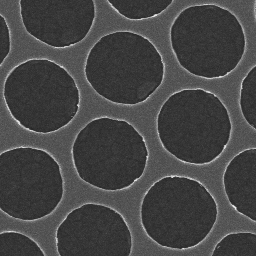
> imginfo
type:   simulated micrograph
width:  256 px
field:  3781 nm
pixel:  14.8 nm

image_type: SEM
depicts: holes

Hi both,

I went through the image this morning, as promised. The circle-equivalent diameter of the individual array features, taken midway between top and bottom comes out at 1.09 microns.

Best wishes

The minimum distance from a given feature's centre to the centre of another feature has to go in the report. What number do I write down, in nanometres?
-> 1290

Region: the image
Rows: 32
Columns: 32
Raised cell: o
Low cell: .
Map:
ooo.........oo.......ooooooooooo
ooo.........ooo.....ooo......ooo
.oo.........oooooooooo........oo
.oo........oooooooooo.........oo
.ooo.......oo.....ooo.........oo
.ooooo...ooo.......oo..........o
.oooooooooo.........oo........oo
oooo..ooooo.........oo........oo
oo......ooo.........ooo......ooo
o........oo.........ooooo...ooo.
o........oo.........oooooooooo..
..........oo.......ooo....oooo..
o.........oooo....ooo......ooo..
o.........oooooooooo........oo..
oo.......ooooooooooo.........o..
ooo.....ooo.....oooo.........oo.
ooooo.oooo.......ooo.........ooo
ooooooooo.........oo.........ooo
oo..ooooo.........ooo.......oooo
......ooo.........oooo.....ooo..
.......oo.........ooooooooooo...
........oo........oooooooooo....
........oo.......ooo....oooo....
........ooooo..oooo.......oo....
........oooooooooo........oo....
.......ooooooooooo.........oo...
o.....ooo.....oooo.........ooo..
ooo.oooo.......ooo.........ooooo
ooooooo.........oo........oooooo
...oooo.........ooo.......oo....
.....oo.........oooo.....oo.....
.....oo.........ooooooooooo.....